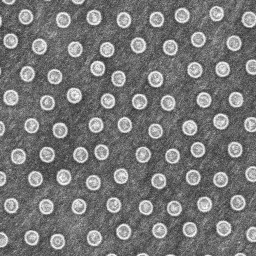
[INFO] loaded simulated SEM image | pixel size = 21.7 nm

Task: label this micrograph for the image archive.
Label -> a regular array of raised bodies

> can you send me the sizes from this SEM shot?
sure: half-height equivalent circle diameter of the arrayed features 301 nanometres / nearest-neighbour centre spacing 595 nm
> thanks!